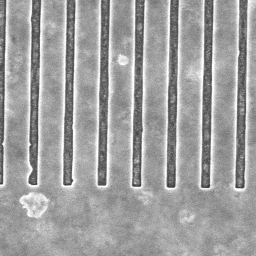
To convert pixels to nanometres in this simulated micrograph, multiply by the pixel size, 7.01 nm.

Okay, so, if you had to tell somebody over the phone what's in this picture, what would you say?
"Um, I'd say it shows parallel lines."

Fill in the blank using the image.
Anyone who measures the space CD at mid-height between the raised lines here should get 64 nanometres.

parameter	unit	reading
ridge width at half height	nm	179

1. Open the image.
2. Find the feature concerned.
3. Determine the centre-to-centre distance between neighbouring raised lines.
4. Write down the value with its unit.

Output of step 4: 34.5 px